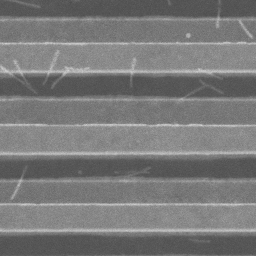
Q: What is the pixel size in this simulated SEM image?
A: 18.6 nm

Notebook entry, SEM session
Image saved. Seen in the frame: lines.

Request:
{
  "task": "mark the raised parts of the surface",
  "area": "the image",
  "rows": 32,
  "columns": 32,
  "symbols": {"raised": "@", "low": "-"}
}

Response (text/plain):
--------------------------------
--------------------------------
@@@@@@@@@@@@@@@@@@@@@@@@@@@@@@@@
@@@@@@@@@@@@@@@@@@@@@@@@@@@@@@@@
@@@@@@@@@@@@@@@@@@@@@@@@@@@@@@@@
@@@@@@@@@@@@@@@@@@@@@@@@@@@@@@@@
@@@@@@@@@@@@@@@@@@@@@@@@@@@@@@@@
@@@@@@@@@@@@@@@@@@@@@@@@@@@@@@@@
@@@@@@@@@@@@@@@@@@@@@@@@@@@@@@@@
--------------------------------
--------------------------------
--------------------------------
@@@@@@@@@@@@@@@@@@@@@@@@@@@@@@@@
@@@@@@@@@@@@@@@@@@@@@@@@@@@@@@@@
@@@@@@@@@@@@@@@@@@@@@@@@@@@@@@@@
@@@@@@@@@@@@@@@@@@@@@@@@@@@@@@@@
@@@@@@@@@@@@@@@@@@@@@@@@@@@@@@@@
@@@@@@@@@@@@@@@@@@@@@@@@@@@@@@@@
@@@@@@@@@@@@@@@@@@@@@@@@@@@@@@@@
--------------------------------
--------------------------------
--------------------------------
--@----------@-@@---------------
@@@@@@@@@@@@@@@@@@@@@@@@@@@@@@@@
@@@@@@@@@@@@@@@@@@@@@@@@@@@@@@@@
@@@@@@@@@@@@@@@@@@@@@@@@@@@@@@@@
@@@@@@@@@@@@@@@@@@@@@@@@@@@@@@@@
@@@@@@@@@@@@@@@@@@@@@@@@@@@@@@@@
@@@@@@@@@@@@@@@@@@@@@@@@@@@@@@@@
--------------------------------
--------------------------------
--------------------------------